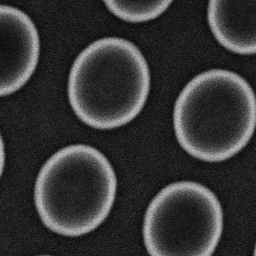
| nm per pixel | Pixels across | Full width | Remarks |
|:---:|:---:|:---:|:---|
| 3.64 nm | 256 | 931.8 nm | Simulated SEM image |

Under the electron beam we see raised bodies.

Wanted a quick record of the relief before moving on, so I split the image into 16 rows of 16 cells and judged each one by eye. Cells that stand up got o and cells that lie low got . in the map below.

.......ooo...ooo
oo...........ooo
oo............oo
oo...oooo.......
oo...oooo.......
o...ooooo...ooo.
.....oooo..ooooo
.....ooo...ooooo
...........oooo.
....oo......oo..
...oooo.........
..ooooo.........
..ooooo...ooo...
...ooo...ooooo..
.........ooooo..
.........oooo...